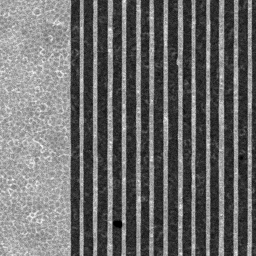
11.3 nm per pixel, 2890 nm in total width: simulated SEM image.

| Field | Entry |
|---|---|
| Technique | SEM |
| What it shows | parallel lines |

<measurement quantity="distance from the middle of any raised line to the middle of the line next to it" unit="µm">0.158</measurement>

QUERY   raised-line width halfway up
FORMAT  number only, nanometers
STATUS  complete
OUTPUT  40.9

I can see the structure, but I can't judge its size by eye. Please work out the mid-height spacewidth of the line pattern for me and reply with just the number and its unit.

114 nm